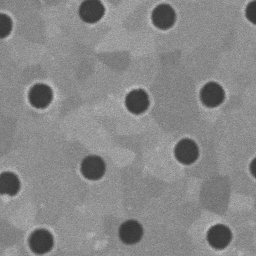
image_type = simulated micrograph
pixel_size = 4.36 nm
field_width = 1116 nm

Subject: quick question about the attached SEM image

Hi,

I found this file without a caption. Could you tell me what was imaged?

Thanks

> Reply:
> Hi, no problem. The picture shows a regular array of holes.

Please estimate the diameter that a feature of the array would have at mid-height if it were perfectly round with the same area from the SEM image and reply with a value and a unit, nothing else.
113 nanometers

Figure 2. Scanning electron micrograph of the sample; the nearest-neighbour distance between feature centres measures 327 nm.